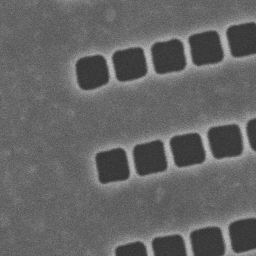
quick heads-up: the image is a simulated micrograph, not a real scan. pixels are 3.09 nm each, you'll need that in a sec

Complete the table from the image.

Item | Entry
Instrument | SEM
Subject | a regular array of holes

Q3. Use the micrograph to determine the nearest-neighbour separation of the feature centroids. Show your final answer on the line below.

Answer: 118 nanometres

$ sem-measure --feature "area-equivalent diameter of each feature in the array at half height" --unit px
35.4